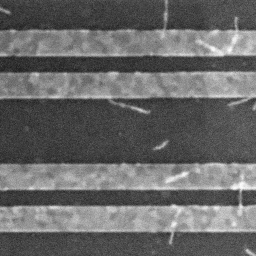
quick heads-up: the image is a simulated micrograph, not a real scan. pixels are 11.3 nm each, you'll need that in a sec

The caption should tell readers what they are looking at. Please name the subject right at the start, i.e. lines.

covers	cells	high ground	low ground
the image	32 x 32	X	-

--------------------------------
--------------------------------
--------------------------------
--------------------------------
XXXXXXXXXXXXXXXXXXXXXXXXXXXXXXXX
XXXXXXXXXXXXXXXXXXXXXXXXXXXXXXXX
XXXXXXXXXXXXXXXXXXXXXXXXXXXXXXXX
--------------------------------
--------------------------------
XXXXXXXXXXXXXXXXXXXXXXXXXXXXXXXX
XXXXXXXXXXXXXXXXXXXXXXXXXXXXXXXX
XXXXXXXXXXXXXXXXXXXXXXXXXXXXXXXX
--------------------------------
--------------------------------
--------------------------------
--------------------------------
--------------------------------
--------------------------------
--------------------------------
--------------------------------
---------------X---------XXX-X--
XXXXXXXXXXXXXXXXXXXXXXXXXXXXXXXX
XXXXXXXXXXXXXXXXXXXXXXXXXXXXXXXX
XXXXXXXXXXXXXXXXXXXXXXXXXXXXXXXX
--------------------------------
--------------------------------
XXXXXXXXXXXXXXXXXXXXXXXXXXXXXXXX
XXXXXXXXXXXXXXXXXXXXXXXXXXXXXXXX
XXXXXXXXXXXXXXXXXXXXXXXXXXXXXXXX
--------------------------------
--------------------------------
--------------------------------